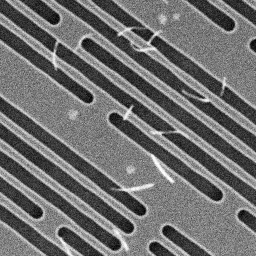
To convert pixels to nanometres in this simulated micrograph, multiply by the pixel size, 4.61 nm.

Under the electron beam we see groups of lines, slits or small figures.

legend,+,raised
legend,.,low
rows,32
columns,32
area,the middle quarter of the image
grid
++.....+++......+++......+++....
+++.....++++.....+++......+++...
.+++......+++......+++......+++.
..++++.....++++.....+++......+++
...++++.....++++.....++++.....++
.....+++.....++++.....++++.....+
+.....++++.....+++......+++.....
++.....++++.....++++.....++++...
+++....+++++......+++......+++..
+++++..++++++......+++......+++.
+++++++++++++++.....++++.....+++
+++++++++++++++++.....+++......+
+++++++++++...++++.....+++......
+++++++++++....++++.....+++.....
+++++++++++......+++......+++...
++++++++++++......+++......+++..
++++++++++++++.....++++.....++++
+++++++++++++++.....++++......++
++++++++++++++++......+++......+
++++++++++++++++++.....++++.....
.++++++++++++++++++.....++++....
..++++++++++++++++++......+++...
...+++++++++++++++++++.....+++..
.....++++++++++++++++++......+++
......++++++++++++++++++......++
++.....+++++++++++++++++++.....+
+++......++++++++++++++++++.....
.+++......++++++++++++++++++....
..++++.....+++++++++++++++++++..
....+++......++++++++++++++++++.
.....+++......++++++++++++++++++
+.....+++......+++++++++++++++++